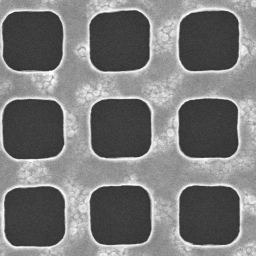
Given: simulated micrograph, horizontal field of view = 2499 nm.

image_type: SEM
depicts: a regular array of holes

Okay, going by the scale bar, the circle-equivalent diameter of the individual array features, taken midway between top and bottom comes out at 640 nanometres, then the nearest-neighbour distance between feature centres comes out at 847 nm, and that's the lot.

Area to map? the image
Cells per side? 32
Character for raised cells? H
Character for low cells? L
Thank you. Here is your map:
HHHHHHHHHHHHHHHHHHHHHHHHHHHHHHHH
HHLLLLHHHHHHHHLLLHHHHHHHHLLLLHHH
HLLLLLLLHHHLLLLLLLLHHHHLLLLLLLHH
LLLLLLLLHHHLLLLLLLLHHHLLLLLLLLHH
LLLLLLLLHHHLLLLLLLLHHHLLLLLLLLHH
LLLLLLLLHHHLLLLLLLLHHHLLLLLLLLHH
LLLLLLLLHHHLLLLLLLLHHHLLLLLLLLHH
HLLLLLLLHHHLLLLLLLLHHHLLLLLLLLHH
HLLLLLLHHHHHLLLLLLHHHHHLLLLLLHHH
HHHHHHHHHHHHHHHHHHHHHHHHHHHHHHHH
HHHHHHHHHHHHHHHHHHHHHHHHHHHHHHHH
HHHHHHHHHHHHHHHHHHHHHHHHHHHHHHHH
HHLLLLHHHHHHHLLLLLHHHHHHLLLLLHHH
HLLLLLLLHHHHLLLLLLLHHHLLLLLLLLHH
LLLLLLLLHHHLLLLLLLLHHHLLLLLLLLHH
LLLLLLLLHHHLLLLLLLLHHHLLLLLLLLHH
LLLLLLLLHHHLLLLLLLLHHHLLLLLLLLHH
LLLLLLLLHHHLLLLLLLLHHHLLLLLLLLHH
HLLLLLLLHHHHLLLLLLLHHHHLLLLLLLHH
HLLLLLLHHHHHLLLLLLHHHHHLLLLLLHHH
HHHHHHHHHHHHHHHHHHHHHHHHHHHHHHHH
HHHHHHHHHHHHHHHHHHHHHHHHHHHHHHHH
HHHHHHHHHHHHHHHHHHHHHHHHHHHHHHHH
HHLLLLLHHHHHLLLLLLHHHHHLLLLLLHHH
HLLLLLLLHHHLLLLLLLLHHHHLLLLLLLHH
HLLLLLLLHHHLLLLLLLLHHHLLLLLLLLHH
HLLLLLLLHHHLLLLLLLLHHHLLLLLLLLHH
HLLLLLLLHHHLLLLLLLLHHHLLLLLLLLHH
HLLLLLLLHHHLLLLLLLLHHHLLLLLLLLHH
HLLLLLLLHHHHLLLLLLLHHHHLLLLLLLHH
HLLLLLLHHHHHHLLLLHHHHHHHLLLLHHHH
HHHHHHHHHHHHHHHHHHHHHHHHHHHHHHHH